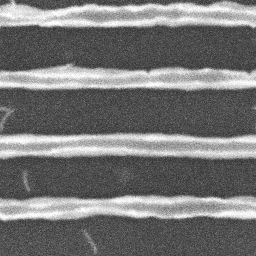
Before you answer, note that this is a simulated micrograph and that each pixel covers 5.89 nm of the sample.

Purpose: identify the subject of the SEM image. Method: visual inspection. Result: one or a few lines or trenches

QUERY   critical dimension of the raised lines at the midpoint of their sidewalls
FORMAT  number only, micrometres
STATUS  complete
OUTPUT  0.0899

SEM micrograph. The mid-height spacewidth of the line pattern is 287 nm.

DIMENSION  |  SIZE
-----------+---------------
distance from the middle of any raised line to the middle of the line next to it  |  378 nm